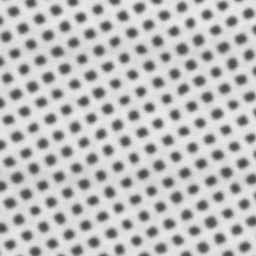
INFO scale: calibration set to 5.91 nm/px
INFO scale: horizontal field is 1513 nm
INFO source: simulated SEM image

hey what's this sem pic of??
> a regular array of holes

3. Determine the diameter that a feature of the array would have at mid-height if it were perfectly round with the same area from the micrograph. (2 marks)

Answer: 62.2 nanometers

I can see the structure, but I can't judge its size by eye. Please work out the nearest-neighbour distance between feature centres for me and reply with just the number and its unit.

108 nm